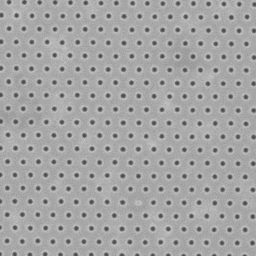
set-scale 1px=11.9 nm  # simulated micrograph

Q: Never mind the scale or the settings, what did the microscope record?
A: a regular array of holes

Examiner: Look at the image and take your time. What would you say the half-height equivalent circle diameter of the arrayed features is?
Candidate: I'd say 63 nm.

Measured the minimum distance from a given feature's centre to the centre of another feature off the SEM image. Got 177 nanometers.